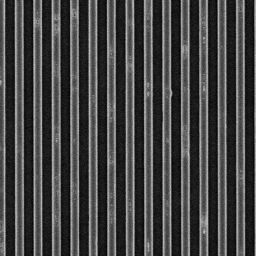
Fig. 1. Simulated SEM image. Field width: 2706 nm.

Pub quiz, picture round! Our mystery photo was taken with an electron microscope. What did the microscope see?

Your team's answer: parallel lines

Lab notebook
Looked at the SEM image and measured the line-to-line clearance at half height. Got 0.115 microns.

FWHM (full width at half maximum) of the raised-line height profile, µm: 0.0846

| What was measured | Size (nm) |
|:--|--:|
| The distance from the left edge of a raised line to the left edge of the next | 195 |